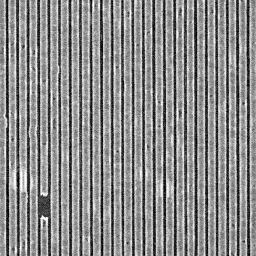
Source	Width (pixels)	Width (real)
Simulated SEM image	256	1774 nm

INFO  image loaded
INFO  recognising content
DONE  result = parallel lines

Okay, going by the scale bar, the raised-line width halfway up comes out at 7.13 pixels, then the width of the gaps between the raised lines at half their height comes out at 20.8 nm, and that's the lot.